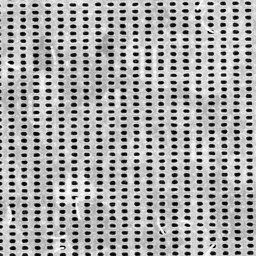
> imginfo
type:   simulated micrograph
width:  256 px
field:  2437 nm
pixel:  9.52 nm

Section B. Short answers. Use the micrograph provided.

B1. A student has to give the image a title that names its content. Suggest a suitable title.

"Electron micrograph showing a regular array of holes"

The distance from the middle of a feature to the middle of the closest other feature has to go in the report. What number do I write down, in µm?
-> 0.0667